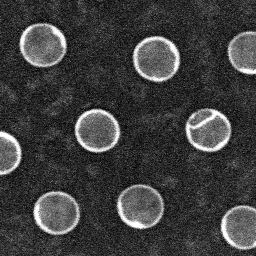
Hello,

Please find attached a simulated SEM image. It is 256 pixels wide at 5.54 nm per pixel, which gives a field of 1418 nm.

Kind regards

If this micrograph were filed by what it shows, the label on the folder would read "raised bodies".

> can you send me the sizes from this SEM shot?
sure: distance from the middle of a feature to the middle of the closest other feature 494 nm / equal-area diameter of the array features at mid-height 0.24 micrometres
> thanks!